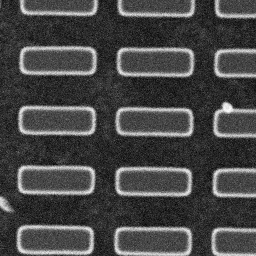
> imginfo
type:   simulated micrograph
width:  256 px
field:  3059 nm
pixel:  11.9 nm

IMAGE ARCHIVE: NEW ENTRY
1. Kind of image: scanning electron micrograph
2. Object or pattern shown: groups of lines, slits or small figures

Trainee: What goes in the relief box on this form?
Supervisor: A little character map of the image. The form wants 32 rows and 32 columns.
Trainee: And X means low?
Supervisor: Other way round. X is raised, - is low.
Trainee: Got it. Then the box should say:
---XXXXXXXXX---XXXXXXXXX---XXXXX
---XXXXXXXXX---XXXXXXXXX---XXXXX
--------------------------------
--------------------------------
--------------------------------
--------------------------------
---XXXXXXXXX---XXXXXXXXX---XXXXX
---XXXXXXXXX---XXXXXXXXX---XXXXX
---XXXXXXXXX---XXXXXXXXX---XXXXX
-------------------------------X
--------------------------------
--------------------------------
--------------------------------
---XXXXXXXX-----------------X---
---XXXXXXXXX---XXXXXXXXX---XXXXX
---XXXXXXXXX---XXXXXXXXX---XXXXX
---XXXXXXXX----XXXXXXXXX---XXXXX
--------------------------------
--------------------------------
--------------------------------
--------------------------------
--XXXXXXXXXX---XXXXXXXXX---XXXXX
--XXXXXXXXXX---XXXXXXXXX---XXXXX
--XXXXXXXXXX---XXXXXXXXX---XXXXX
--------------------------------
--------------------------------
--------------------------------
--------------------------------
---XXXXXXXX---------------------
--XXXXXXXXXX---XXXXXXXXX---XXXXX
--XXXXXXXXXX---XXXXXXXXX---XXXXX
---XXXXXXXX----XXXXXXXXX---XXXXX